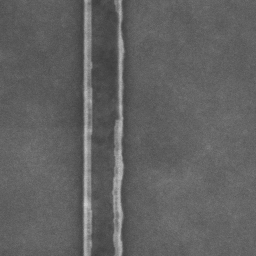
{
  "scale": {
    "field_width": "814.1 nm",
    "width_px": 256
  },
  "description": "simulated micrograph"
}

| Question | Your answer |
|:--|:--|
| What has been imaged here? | one or a few lines or trenches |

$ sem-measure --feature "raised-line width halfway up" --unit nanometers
114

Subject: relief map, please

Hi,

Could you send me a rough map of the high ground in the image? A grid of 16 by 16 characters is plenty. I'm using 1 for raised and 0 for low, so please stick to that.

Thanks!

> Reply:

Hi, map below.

0000011000000000
0000011000000000
0000011100000000
0000011100000000
0000011100000000
0000011100000000
0000011100000000
0000011100000000
0000011100000000
0000011100000000
0000011100000000
0000011000000000
0000011000000000
0000011100000000
0000011100000000
0000011100000000